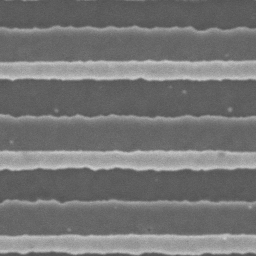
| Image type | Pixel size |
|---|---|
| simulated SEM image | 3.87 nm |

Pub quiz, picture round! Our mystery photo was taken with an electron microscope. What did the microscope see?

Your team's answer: lines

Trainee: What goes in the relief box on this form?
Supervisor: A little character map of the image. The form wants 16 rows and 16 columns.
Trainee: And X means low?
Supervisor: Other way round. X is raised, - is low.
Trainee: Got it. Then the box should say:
----------------
----------------
XXXXXXXXXXXXXXXX
XXXXXXXXXXXXXXXX
XXXXXXXXXXXXXXXX
----------------
----------------
XXXXXXXXXXXXXXXX
XXXXXXXXXXXXXXXX
XXXXXXXXXXXXXXXX
XXXX-XXXXXXXXXXX
----------------
----------------
XXXXXXXXXXXXXXXX
XXXXXXXXXXXXXXXX
XXXXXXXXXXXXXXXX